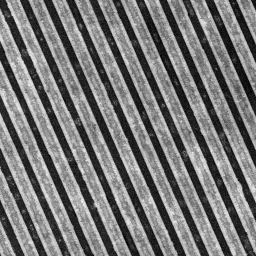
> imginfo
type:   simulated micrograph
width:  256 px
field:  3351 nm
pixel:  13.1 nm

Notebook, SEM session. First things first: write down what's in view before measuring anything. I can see parallel lines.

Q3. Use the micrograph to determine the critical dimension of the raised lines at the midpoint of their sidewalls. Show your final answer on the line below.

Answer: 141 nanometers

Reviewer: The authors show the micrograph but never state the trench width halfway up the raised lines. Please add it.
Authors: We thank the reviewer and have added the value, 141 nm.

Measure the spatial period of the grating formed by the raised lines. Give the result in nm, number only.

277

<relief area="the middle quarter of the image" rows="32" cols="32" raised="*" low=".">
*....**...***...***...***...**..
**...***...**...***...***...***.
**....**...***...***...***...**.
***...***...**...***...***...***
.**....**...***...***...**....**
.***...***...**...***...***...**
.***...***...***...**....**...**
..***...**...***...***...***...*
..***...***...**...***...***...*
...**....**...***...***...**...*
...***...***...**...***...***...
*...**...***...***...***...**...
*...***...***...**...***...***..
**...**...***...***...***...**..
**...***...**....**...***...***.
**...***...***...***...**...***.
***...**...***...***...***...**.
***...***...***...**...***...***
.***...**...***...***...**....**
.***...***...***...**...***...**
..***...**...***...***...**....*
..***...***...***...**...***...*
...**...***...***...***...**....
...***...***...**...***...***...
...***...***...***...**...***...
*...***...**...***...***...***..
*...***...***...***...**...***..
**...***...**...***...***...***.
**...***...***...***...**...***.
***...***...**...***...***...***
***...***...***...**....**...***
.***...**...***...***...***...**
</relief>